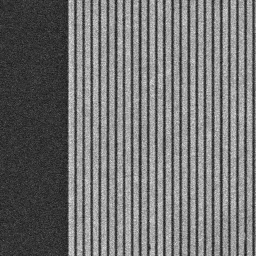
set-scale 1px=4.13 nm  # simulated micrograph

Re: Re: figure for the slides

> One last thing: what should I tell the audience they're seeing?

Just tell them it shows parallel lines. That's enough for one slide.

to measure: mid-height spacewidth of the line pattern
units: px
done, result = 3.63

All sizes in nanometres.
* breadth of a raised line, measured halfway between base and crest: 19.1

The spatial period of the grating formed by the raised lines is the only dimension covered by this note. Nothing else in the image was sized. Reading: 0.0335 micrometres